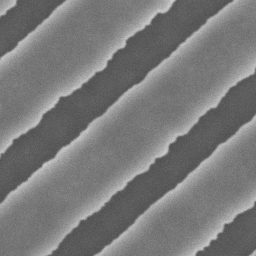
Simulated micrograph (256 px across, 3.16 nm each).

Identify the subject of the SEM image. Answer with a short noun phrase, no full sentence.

lines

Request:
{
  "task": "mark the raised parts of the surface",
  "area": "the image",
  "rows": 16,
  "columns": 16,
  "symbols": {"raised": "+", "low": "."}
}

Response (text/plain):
+...+++++++...++
...++++++....+++
.+++++++....++++
+++++++....+++++
++++++...+++++++
+++++...++++++..
+++....+++++++..
+++...++++++....
+....++++++....+
....++++++...+++
..+++++++...++++
.+++++++...+++++
+++++++...++++++
++++++...++++++.
++++....++++++..
+++....++++++...